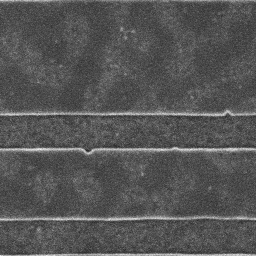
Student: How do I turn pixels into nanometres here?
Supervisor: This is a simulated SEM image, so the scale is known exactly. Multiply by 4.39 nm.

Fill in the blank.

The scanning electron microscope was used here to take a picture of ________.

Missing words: one or a few lines or trenches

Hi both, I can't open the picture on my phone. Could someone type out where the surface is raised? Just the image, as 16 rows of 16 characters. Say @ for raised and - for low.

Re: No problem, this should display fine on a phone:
@@@@@@@@@@@@@@@@
@@@@@@@@@@@@@@@@
@@@@@@@@@@@@@@@@
@@@@@@@@@@@@@@@@
@@@@@@@@@@@@@@@@
@@@@@@@@@@@@@@@@
@@@@@@@@@@@@@@@@
----------------
----------------
@@@@@@@@@@@@@@@@
@@@@@@@@@@@@@@@@
@@@@@@@@@@@@@@@@
@@@@@@@@@@@@@@@@
@@@@@@@@@@@@@@@@
----------------
----------------